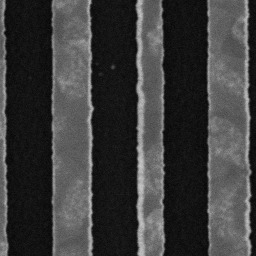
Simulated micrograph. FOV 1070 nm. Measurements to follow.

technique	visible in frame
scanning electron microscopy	lines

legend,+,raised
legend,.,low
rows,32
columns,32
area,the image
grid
+......++++......+++......+++++.
.......++++......+++......+++++.
.......++++......+++......+++++.
+......++++......+++......+++++.
+......++++......+++......+++++.
+......++++......+++......+++++.
+......++++......+++......+++++.
+......++++......+++......+++++.
+......++++......+++......+++++.
+......++++......+++......+++++.
+......++++......+++......+++++.
+......++++......+++......+++++.
+......++++......+++......+++++.
+......+++++.....+++......+++++.
+......++++......+++......+++++.
+......++++......+++......+++++.
+......++++......+++......+++++.
+......++++......+++......+++++.
+......++++......+++......+++++.
+......++++......+++......+++++.
+......++++......+++......+++++.
+......++++......+++......+++++.
+......++++......+++......+++++.
+......++++......+++......+++++.
+......++++......+++......+++++.
+......++++......+++......+++++.
+......++++......+++......+++++.
+......++++......+++......+++++.
+......++++......+++......+++++.
+......++++......++++.....+++++.
+......+++++.....++++.....+++++.
+......++++......+++......+++++.